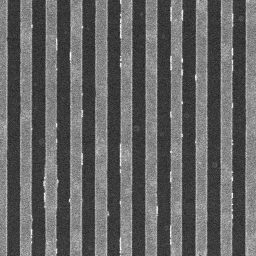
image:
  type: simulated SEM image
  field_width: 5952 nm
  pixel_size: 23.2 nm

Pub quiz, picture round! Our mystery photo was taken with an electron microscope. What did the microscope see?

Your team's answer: parallel lines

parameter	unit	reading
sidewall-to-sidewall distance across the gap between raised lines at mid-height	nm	340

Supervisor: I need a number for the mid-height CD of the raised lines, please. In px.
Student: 10.7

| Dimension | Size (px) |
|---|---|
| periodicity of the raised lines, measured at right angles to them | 25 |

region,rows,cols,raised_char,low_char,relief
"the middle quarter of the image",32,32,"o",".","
..oo....ooo...ooo....oo....oo...
..oo....ooo...ooo....oo....oo...
..oo....ooo...ooo....oo....oo...
..oo....ooo...ooo....oo....oo...
..oo....ooo...ooo....oo....oo...
..oo....ooo...ooo....oo....oo...
..oo....ooo...ooo....oo....oo...
..oo....ooo...ooo....oo....oo...
..oo....ooo...ooo....oo....oo...
..oo....ooo...ooo....oo....oo...
..oo....ooo...ooo....oo....oo...
..oo....ooo...ooo....oo....oo...
..oo....ooo...ooo....oo....oo...
..oo....ooo...ooo....oo....oo...
..oo....ooo...ooo....oo....oo...
..oo....ooo...ooo....oo....oo...
..oo....ooo...ooo....oo....oo...
..oo....ooo...ooo....oo....oo...
..oo....ooo...ooo....oo....oo...
..oo....ooo...ooo....oo....oo...
..oo....ooo...ooo....oo....oo...
..oo....ooo...ooo....oo....oo...
..oo....ooo...ooo....oo....oo...
..oo....ooo...ooo....oo....oo...
..oo....ooo...ooo....oo....oo...
..oo....ooo...ooo....oo....oo...
..oo....ooo...ooo...ooo....oo...
..oo....ooo...ooo...ooo....oo...
..oo....ooo...ooo...ooo....oo...
..oo....ooo...ooo....oo....oo...
..oo....ooo...ooo....oo....oo...
..oo....ooo...ooo....oo....oo...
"